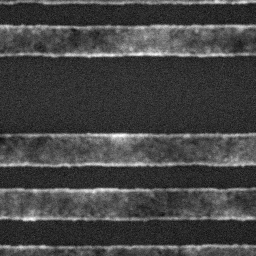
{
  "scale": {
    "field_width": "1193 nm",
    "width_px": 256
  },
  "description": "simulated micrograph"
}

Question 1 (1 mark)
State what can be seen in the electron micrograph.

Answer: lines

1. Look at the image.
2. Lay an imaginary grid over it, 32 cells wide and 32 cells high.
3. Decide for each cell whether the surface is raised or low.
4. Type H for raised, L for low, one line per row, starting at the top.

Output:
LLLLLLLLLLLLLLLLLLLLLLLLLLLLLLLL
LLLLLLLLLLLLLLLLLLLLLLLLLLLLLLLL
LLLLLLLLLLLLLLLLLLLLLLLLLLLLLLLL
HHHHHHHHHHHHHHHHHHHHHHHHHHHHHHHH
HHHHHHHHHHHHHHHHHHHHHHHHHHHHHHHH
HHHHHHHHHHHHHHHHHHHHHHHHHHHHHHHH
HHHHHHHHHHHHHHHHHHHHHHHHHHHHHHHH
LLLLLLLLLLLLLLLLLLLLLLLLLLLLLLLL
LLLLLLLLLLLLLLLLLLLLLLLLLLLLLLLL
LLLLLLLLLLLLLLLLLLLLLLLLLLLLLLLL
LLLLLLLLLLLLLLLLLLLLLLLLLLLLLLLL
LLLLLLLLLLLLLLLLLLLLLLLLLLLLLLLL
LLLLLLLLLLLLLLLLLLLLLLLLLLLLLLLL
LLLLLLLLLLLLLLLLLLLLLLLLLLLLLLLL
LLLLLLLLLLLLLLLLLLLLLLLLLLLLLLLL
LLLLLLLLLLLLLLLLLLLLLLLLLLLLLLLL
LLLLLLLLLLLLLLLLLLLLLLLLLLLLLLLL
HHHHHHHHHHHHHHHHHHHHHHHHHHHHHHHH
HHHHHHHHHHHHHHHHHHHHHHHHHHHHHHHH
HHHHHHHHHHHHHHHHHHHHHHHHHHHHHHHH
HHHHHHHHHHHHHHHHHHHHHHHHLHHHHHHH
LLLLLLLLLLLLLLLLLLLLLLLLLLLLLLLL
LLLLLLLLLLLLLLLLLLLLLLLLLLLLLLLL
LLLLLLLLLLLLLLLLLLLLLLLLLLLLLLLL
HHHHHHHHHHHHHHHHHHHHHHHHHHHHHHHH
HHHHHHHHHHHHHHHHHHHHHHHHHHHHHHHH
HHHHHHHHHHHHHHHHHHHHHHHHHHHHHHHH
LLLLLLLLLLLLLLLLLHHLLLLLLLLLLLLL
LLLLLLLLLLLLLLLLLLLLLLLLLLLLLLLL
LLLLLLLLLLLLLLLLLLLLLLLLLLLLLLLL
LLLLLLLLLLLLLLLLLLLLLLLLLLLLLLLL
HHHHHHHHHHHHHHHHHHHHHHHHHHHHHHHH